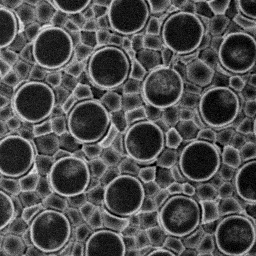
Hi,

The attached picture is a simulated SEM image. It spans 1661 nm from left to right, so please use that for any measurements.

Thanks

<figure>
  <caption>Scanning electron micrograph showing a regular array of raised bodies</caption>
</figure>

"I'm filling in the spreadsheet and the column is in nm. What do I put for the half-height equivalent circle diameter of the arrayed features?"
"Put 255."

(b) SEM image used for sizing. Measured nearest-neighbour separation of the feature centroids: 375 nm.